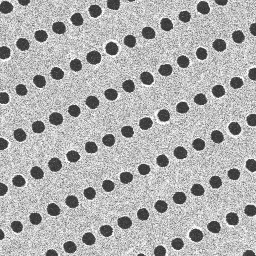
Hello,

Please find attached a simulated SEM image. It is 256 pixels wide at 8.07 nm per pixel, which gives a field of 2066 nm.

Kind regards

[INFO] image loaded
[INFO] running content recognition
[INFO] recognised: a regular array of holes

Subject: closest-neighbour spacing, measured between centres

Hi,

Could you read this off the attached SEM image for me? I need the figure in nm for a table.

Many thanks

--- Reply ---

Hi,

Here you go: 159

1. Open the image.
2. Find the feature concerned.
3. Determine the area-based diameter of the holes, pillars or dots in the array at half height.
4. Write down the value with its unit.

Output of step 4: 106 nm